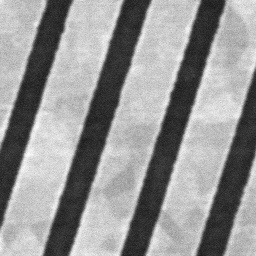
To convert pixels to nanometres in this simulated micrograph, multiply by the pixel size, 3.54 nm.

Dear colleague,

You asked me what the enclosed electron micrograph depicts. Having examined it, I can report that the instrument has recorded lines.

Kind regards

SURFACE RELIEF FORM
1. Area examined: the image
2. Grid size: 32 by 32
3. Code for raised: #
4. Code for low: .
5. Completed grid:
######...######....######...####
#####....######....######...####
#####...#######...######....####
#####...######....######...#####
####....######....######...#####
####...#######...######....#####
####...######....######...######
###....######....######...######
###....######...######....######
###...######....######...#######
###...######....######...######.
##....######...######....######.
##...######....######....######.
##...######....######...######..
#....######...######....######..
#...######....######...#######..
#...######....######...######...
....######...######....######...
...######....######....######...
...######....######...######....
...######...#######...######....
..#######...######....######...#
..######....######...######....#
..######...#######...######....#
.#######...######....######...##
.######....######...######....##
.######....######...######....##
.######...######....######...###
######....######...######....###
######....######...######....###
######...######....######...####
#####....######...#######...####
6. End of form